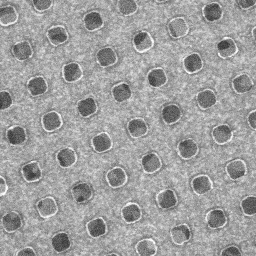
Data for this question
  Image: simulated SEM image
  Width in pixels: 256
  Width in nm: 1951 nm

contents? a regular array of raised bodies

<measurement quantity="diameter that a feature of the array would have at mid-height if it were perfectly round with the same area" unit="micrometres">0.152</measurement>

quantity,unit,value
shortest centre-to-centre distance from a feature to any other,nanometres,287